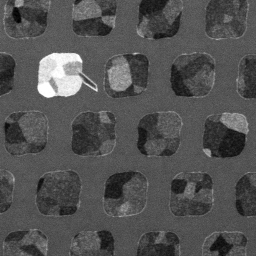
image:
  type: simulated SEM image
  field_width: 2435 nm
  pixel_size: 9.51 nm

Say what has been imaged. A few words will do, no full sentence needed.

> a regular array of raised bodies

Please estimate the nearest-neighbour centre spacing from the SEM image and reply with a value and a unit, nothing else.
626 nm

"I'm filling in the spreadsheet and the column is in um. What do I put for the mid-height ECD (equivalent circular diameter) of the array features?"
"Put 0.45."